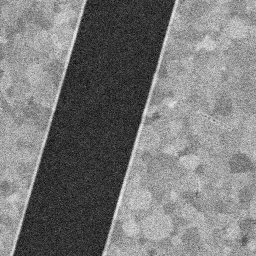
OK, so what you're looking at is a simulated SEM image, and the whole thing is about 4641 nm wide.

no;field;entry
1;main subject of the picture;one or a few lines or trenches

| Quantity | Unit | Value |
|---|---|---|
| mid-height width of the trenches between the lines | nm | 1620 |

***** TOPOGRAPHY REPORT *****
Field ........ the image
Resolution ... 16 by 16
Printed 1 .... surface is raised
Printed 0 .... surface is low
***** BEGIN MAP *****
1111100000011111
1111100000011111
1111100000111111
1111000000111111
1111000000111111
1111000000111111
1110000001111111
1110000001111111
1110000001111111
1110000011111111
1100000011111111
1100000011111111
1100000011111111
1000000111111111
1000000111111111
1000000111111111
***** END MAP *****